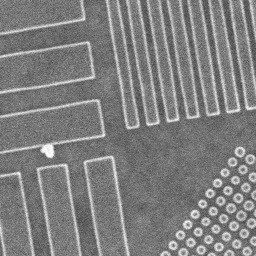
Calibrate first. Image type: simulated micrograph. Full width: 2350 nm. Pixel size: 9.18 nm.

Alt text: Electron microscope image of groups of lines, slits or small figures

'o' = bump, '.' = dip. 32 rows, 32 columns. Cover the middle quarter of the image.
ooooooo......ooo..ooo...ooo.oooo
ooooooo.......ooo.oooo..ooo..ooo
oooooooo......ooo..ooo..ooo..ooo
ooooooo.......ooo..ooo..ooo..ooo
oo............ooo..ooo..ooo..ooo
..............ooo..ooo..ooo..ooo
..............ooo..ooo...oo...oo
...............oo...ooo..ooo..oo
...............oo...ooo..ooo..oo
.....oooo......ooo..ooo..ooo..oo
ooooooooo......ooo..ooo..ooo..oo
ooooooooo......ooo..ooo..ooo...o
ooooooooo......ooo..ooo...oo...o
ooooooooo......ooo...ooo..oo...o
ooooooooo.......oo...ooo........
oooooooooo......oo..............
oooooooooo......................
oooooooooo......................
ooooooo.........................
................................
................................
................................
................................
..........oo....................
......oooooo....................
o....oooooooo...................
o....oooooooo...................
o.....ooooooo...................
o.....ooooooo...................
o.....ooooooo...................
o.....ooooooo...................
o.....oooooooo..................